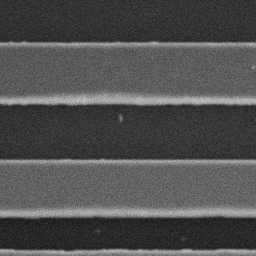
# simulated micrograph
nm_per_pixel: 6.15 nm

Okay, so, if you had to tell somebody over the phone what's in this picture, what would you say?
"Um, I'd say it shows lines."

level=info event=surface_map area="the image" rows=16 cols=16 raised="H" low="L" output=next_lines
LLLLLLLLLLLLLLLL
LLLLLLLLLLLLLLLL
LLLLLLLLLLLLLLLL
HHHHHHHHHHHHHHHH
HHHHHHHHHHHHHHHH
HHHHHHHHHHHHHHHH
LLLLLLLLLLLLLLLL
LLLLLLLLLLLLLLLL
LLLLLLLLLLLLLLLL
LLLLLLLLLLLLLLLL
HHHHHHHHHHHHHHHH
HHHHHHHHHHHHHHHH
HHHHHHHHHHHHHHHH
HHHHHHHHHHHHHLHH
LLLLLLLLLLLLLLLL
LLLLLLLLLLLLLLLL